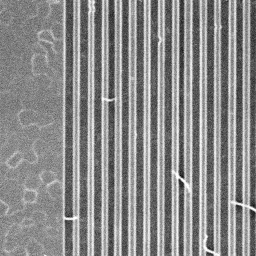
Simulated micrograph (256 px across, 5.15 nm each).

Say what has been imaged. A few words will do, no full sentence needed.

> parallel lines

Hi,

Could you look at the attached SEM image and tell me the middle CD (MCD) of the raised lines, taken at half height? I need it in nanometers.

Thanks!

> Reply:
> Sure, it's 27.7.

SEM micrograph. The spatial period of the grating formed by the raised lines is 0.0729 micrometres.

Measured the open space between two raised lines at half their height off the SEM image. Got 45.7 nm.